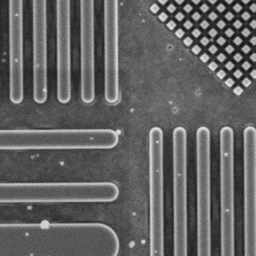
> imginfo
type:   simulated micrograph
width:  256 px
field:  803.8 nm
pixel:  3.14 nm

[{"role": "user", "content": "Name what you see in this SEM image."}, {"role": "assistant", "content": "groups of lines, slits or small figures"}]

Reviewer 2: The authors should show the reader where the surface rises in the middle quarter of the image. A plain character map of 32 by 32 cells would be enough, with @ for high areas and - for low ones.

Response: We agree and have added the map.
@---@@@---@@@-------------------
@---@@@---@@@-------------------
@---@@@---@@@-------------------
@---@@@---@@@-------------------
@---@@@---@@@-------------------
@---@@@---@@@-------------------
@----@@---@@@-------------------
@----@@---@@@-------------------
@----@@----@@-------------------
@-------------------------------
--------------------------------
--------------------------------
--------------------------------
--------------------------------
--------------------------------
--------------------------------
----------------------@@----@@--
@@@@@@@@@@@@@---------@@----@@--
@@@@@@@@@@@@@---------@@----@@--
@@@@@@@@@@@@@---------@@----@@--
@@@@@@@@@@@@----------@@----@@--
----------------------@@----@@--
----------------------@@----@@--
----------------------@@----@@--
----------------------@@----@@--
----------------------@@----@@--
----------------------@@----@@--
----------------------@@----@@--
----------------------@@----@@--
----------------------@@----@@--
@@@@@@@@@@@@@---------@@----@@--
@@@@@@@@@@@@@---------@@----@@--